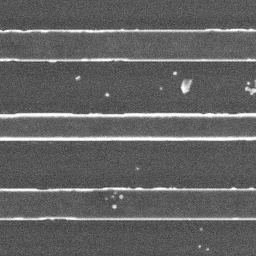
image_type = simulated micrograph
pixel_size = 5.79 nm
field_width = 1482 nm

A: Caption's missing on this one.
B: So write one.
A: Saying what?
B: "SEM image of lines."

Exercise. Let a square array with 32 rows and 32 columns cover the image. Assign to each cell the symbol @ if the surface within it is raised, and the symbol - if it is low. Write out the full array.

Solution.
--------------------------------
--------------------------------
--------------------------------
--------------------------------
@@@@@@@@@@@@@@@@@@@@@@@@@@@@@@@@
@@@@@@@@@@@@@@@@@@@@@@@@@@@@@@@@
@@@@@@@@@@@@@@@@@@@@@@@@@@@@@@@@
@-@@@@@@@@@@@@-@@@@@@@@@@@@@@@@@
--------------------------------
--------------------------------
--------------------------------
--------------------------------
--------------------------------
--------------------------------
@@@@@@@@@@@@@@@@@@@@@@@@@@@@@@@@
@@@@@@@@@@@@@@@@@@@@@@@@@@@@@@@@
@@@@@@@@@@@@@@@@@@@@@@@@@@@@@@@@
--------------------------------
--------------------------------
--------------------------------
--------------------------------
--------------------------------
--------------------------------
--------------------------------
@@@@@@@@@@@@@@@@@@@@@@@@@@@@@@@@
@@@@@@@@@@@@@@@@@@@@@@@@@@@@@@@@
@@@@@@@@@@@@@@@@@@@@@@@@@@@@@@@@
--------------------------------
--------------------------------
--------------------------------
--------------------------------
--------------------------------